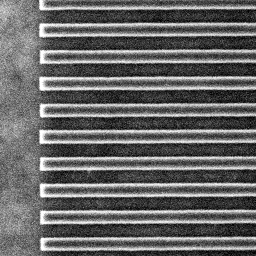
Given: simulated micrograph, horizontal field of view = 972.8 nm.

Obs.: parallel lines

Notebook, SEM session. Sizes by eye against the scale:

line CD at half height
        0.0461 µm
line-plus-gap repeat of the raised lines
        102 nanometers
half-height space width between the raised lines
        0.0571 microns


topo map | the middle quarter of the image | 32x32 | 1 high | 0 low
00000000000000000000000000000000
00000000000000000000000000000000
00000000000000000000000000000000
00000111111011111111111111111111
11111111111111111111111111111111
11111111111111111111111111111111
00000000000000000000000000000000
00000000000000000000000000000000
00000000000000000000000000000000
00000000000000000000000000000000
11111111111111111111111111111111
11111111111111111111111111111111
11111111111111111111111111111111
00000000000000000000000000000000
00000000000000000000000000000000
00000000000000000000000000000000
00000000000000000000000000000000
11111111111111111111111111111111
11111111111111111111111111111111
11111111111111111111111111111111
00000000000000000000000000000000
00000000000000000000000000000000
00000000000000000000000000000000
11111111111111111110111110111111
11111111111111111111111111111111
11111111111111111111111111111111
00000000000000000000000000000000
00000000000000000000000000000000
00000000000000000000000000000000
00000000000000000000000000000000
11111111111111111111111111111111
11111111111111111111111111111111